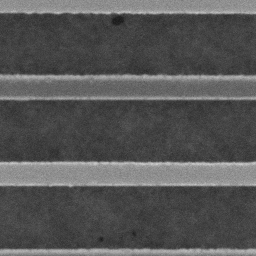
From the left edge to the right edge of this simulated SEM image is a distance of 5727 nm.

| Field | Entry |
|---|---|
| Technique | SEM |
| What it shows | lines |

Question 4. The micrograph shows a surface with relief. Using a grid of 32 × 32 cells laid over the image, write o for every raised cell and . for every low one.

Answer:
oooooooooooooooooooooooooooooooo
oooooooooooooooooooooooooooooooo
................................
................................
................................
................................
................................
................................
................................
................................
oooooooooooooooooooooooooooooooo
oooooooooooooooooooooooooooooooo
................................
................................
................................
................................
................................
................................
................................
................................
ooooo.o.o...o...................
oooooooooooooooooooooooooooooooo
oooooooooooooooooooooooooooooooo
................................
................................
................................
................................
................................
................................
................................
................................
oooooooooooooooooooooooooooooooo